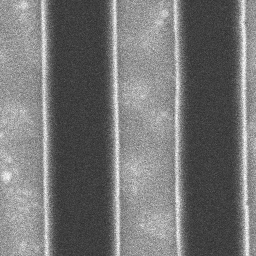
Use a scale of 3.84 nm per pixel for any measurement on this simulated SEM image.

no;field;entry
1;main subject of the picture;one or a few lines or trenches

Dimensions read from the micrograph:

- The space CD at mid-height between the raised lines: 226 nanometres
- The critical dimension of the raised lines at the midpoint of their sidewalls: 276 nanometres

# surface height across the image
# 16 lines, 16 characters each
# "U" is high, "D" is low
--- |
DDDUUUUDDDDUUUUD
DDDUUUUDDDDUUUUD
DDDUUUUDDDDUUUUD
DDDUUUUDDDDUUUUD
DDDUUUUDDDDUUUUD
DDDUUUUDDDDUUUUD
DDDUUUUDDDDUUUUD
DDDUUUUDDDDUUUUD
DDDUUUUDDDDUUUUD
DDDUUUUDDDDUUUUD
DDDUUUUDDDDUUUUD
DDDUUUUDDDDUUUUD
DDDUUUUDDDDUUUUD
DDDUUUUDDDDUUUUD
DDDUUUUDDDDUUUUD
DDDUUUUDDDDUUUUD